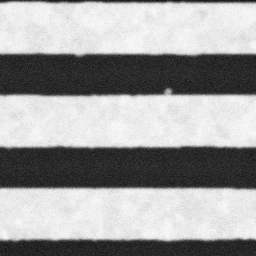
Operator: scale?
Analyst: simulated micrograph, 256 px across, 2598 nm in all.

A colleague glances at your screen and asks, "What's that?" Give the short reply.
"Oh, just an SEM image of lines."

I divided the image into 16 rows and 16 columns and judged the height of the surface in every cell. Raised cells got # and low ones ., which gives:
################
################
################
................
................
................
################
################
################
................
................
................
################
################
################
................